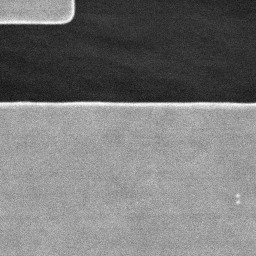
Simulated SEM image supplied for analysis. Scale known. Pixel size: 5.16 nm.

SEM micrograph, wiring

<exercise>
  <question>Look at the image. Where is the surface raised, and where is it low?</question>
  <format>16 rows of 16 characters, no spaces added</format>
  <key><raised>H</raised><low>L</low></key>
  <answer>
HHHHHLLLLLLLLLLL
LLLLLLLLLLLLLLLL
LLLLLLLLLLLLLLLL
LLLLLLLLLLLLLLLL
LLLLLLLLLLLLLLLL
LLLLLLLLLLLLLLLL
HHHHHHHHHHHHHHHH
HHHHHHHHHHHHHHHH
HHHHHHHHHHHHHHHH
HHHHHHHHHHHHHHHH
HHHHHHHHHHHHHHHH
HHHHHHHHHHHHHHHH
HHHHHHHHHHHHHHHH
HHHHHHHHHHHHHHHH
HHHHHHHHHHHHHHHH
HHHHHHHHHHHHHHHH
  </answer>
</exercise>